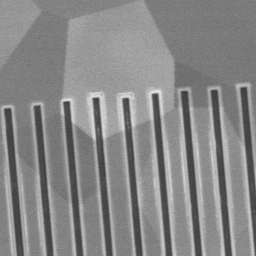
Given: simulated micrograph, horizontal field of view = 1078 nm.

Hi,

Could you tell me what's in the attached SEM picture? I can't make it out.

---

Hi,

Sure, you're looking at parallel lines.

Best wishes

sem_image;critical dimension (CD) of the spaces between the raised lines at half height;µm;0.032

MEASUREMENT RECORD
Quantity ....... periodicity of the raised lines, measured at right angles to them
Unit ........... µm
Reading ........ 0.125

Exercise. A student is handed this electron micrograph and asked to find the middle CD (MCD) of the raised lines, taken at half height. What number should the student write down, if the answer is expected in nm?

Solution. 92.2